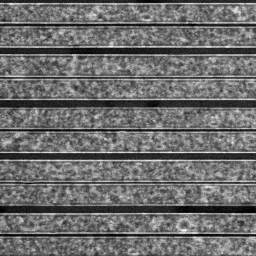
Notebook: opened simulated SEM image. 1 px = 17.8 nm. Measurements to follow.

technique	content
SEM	parallel lines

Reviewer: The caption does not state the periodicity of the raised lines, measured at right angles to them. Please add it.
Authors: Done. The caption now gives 466 nm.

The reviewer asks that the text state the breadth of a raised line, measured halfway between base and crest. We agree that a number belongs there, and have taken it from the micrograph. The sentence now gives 373 nanometres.